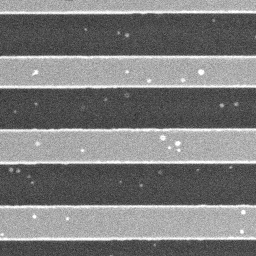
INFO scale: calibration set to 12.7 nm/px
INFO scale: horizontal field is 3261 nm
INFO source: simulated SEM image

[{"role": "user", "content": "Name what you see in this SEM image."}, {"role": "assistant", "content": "lines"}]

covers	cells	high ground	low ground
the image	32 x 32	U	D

UUUUUUUUUUUUUUUUUUUUUUUUUUUUUUUU
UUUUUUUUUUUUUUUUUUUUUUUUUUUUUUUU
DDDDDDDDDDDDDDDDDDDDDDDDDDDDDDDD
DDDDDDDDDDDDDDDDDDDDDDDDDDDDDDDD
DDDDDDDDDDDDDDDDDDDDDDDDDDDDDDDD
DDDDDDDDDDDDDDDDDDDDDDDDDDDDDDDD
DDDDDDDDDDDDDDDDDDDDDDDDDDDDDDDD
UUUUUUUUUUUUUUUUUUUUUUUUUUUUUUUU
UUUUUUUUUUUUUUUUUUUUUUUUUUUUUUUU
UUUUUUUUUUUUUUUUUUUUUUUUUUUUUUUU
UUUUUUUUUUUUUUUUUUUUUUUUUUUUUUUU
DDDDDDDDDDDDDDDDDDDDDDDDDDDDDDDD
DDDDDDDDDDDDDDDDDDDDDDDDDDDDDDDD
DDDDDDDDDDDDDDDDDDDDDDDDDDDDDDDD
DDDDDDDDDDDDDDDDDDDDDDDDDDDDDDDD
DDDDDDDDDDDDDDDDDDDDDDDDDDDDDDDD
UUUUUUUUUUUUUUUUUUUUUUUUUUUUUUUU
UUUUUUUUUUUUUUUUUUUUUUUUUUUUUUUU
UUUUUUUUUUUUUUUUUUUUUUUUUUUUUUUU
UUUUUUUUUUUUUUUUUUUUUUUUUUUUUUUU
DDDDDDDDDDDDDDDDDDDDDDDDDDDDDDDD
DDDDDDDDDDDDDDDDDDDDDDDDDDDDDDDD
DDDDDDDDDDDDDDDDDDDDDDDDDDDDDDDD
DDDDDDDDDDDDDDDDDDDDDDDDDDDDDDDD
DDDDDDDDDDDDDDDDDDDDDDDDDDDDDDDD
DDDDDDDDDDDDDDDDDDDDDDDDDDDDDDDD
UUUUUUUUUUUUUUUUUUUUUUUUUUUUUUUU
UUUUUUUUUUUUUUUUUUUUUUUUUUUUUUUU
UUUUUUUUUUUUUUUUUUUUUUUUUUUUUUUU
UUUUUUUUUUUUUUUUUUUUUUUUUUUUUUUU
DDDDDDDDDDDDDDDDDDDDDDDDDDDDDDDD
DDDDDDDDDDDDDDDDDDDDDDDDDDDDDDDD